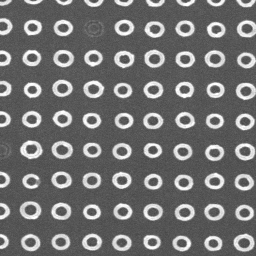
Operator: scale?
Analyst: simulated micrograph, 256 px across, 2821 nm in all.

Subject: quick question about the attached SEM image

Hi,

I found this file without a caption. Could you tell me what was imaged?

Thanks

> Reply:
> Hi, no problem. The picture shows a regular array of ring-shaped raised bodies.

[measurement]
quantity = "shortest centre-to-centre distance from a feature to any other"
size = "328 nanometres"